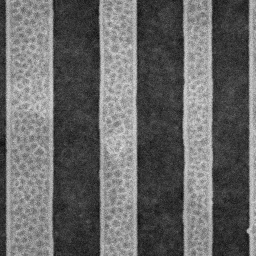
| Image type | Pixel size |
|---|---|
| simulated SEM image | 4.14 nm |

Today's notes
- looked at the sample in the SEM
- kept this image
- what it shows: one or a few lines or trenches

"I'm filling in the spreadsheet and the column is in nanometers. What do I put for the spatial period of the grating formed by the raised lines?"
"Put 348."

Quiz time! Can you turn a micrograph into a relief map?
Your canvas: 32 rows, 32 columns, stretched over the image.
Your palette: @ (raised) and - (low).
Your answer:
-@@@@@-------@@@@------@@@-----@
-@@@@@-------@@@@------@@@-----@
-@@@@@-------@@@@------@@@-----@
-@@@@@-------@@@@------@@@-----@
-@@@@@-------@@@@------@@@-----@
-@@@@@-------@@@@------@@@-----@
-@@@@@-------@@@@------@@@-----@
-@@@@@-------@@@@------@@@-----@
-@@@@@-------@@@@------@@@-----@
-@@@@@-------@@@@------@@@-----@
-@@@@@-------@@@@------@@@-----@
-@@@@@-------@@@@------@@@-----@
-@@@@@-------@@@@------@@@-----@
-@@@@@-------@@@@------@@@------
-@@@@@-------@@@@------@@@------
-@@@@@-------@@@@------@@@------
-@@@@@-------@@@@------@@@------
-@@@@@-------@@@@------@@@------
-@@@@@-------@@@@------@@@------
-@@@@@-------@@@@------@@@------
-@@@@@-------@@@@------@@@------
-@@@@@-------@@@@------@@@------
-@@@@@-------@@@@------@@@------
-@@@@@-------@@@@------@@@------
-@@@@@-------@@@@------@@@------
-@@@@@-------@@@@------@@@------
-@@@@@-------@@@@------@@@------
-@@@@@-------@@@@------@@@------
-@@@@@-------@@@@------@@@-----@
-@@@@@-------@@@@------@@@-----@
-@@@@@-------@@@@------@@@------
-@@@@@-------@@@@------@@@------